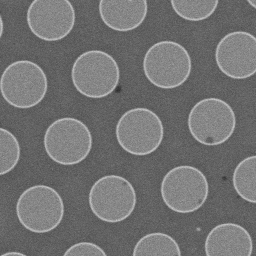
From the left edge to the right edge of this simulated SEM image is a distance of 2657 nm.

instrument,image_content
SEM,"an array of small figures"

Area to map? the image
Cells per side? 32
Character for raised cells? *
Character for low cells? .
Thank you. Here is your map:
....*****....*****....*****....*
....*****....*****....*****.....
...******....*****......*.......
....*****.....***...............
.....***....................****
....................**.....*****
...........**.....*****....*****
..........****....******...*****
.****....******...******....****
******...******...*****......**.
******...******....****.........
******....****..................
.****.....................*.....
........................*****...
...............*****....*****...
.......***.....*****....*****...
*.....*****....*****....*****...
**....*****....*****.....***....
**....*****....****.............
**....*****.....................
**......*.....................**
*....................****....***
............****....******...***
....**......*****...******...***
...****....******...******....**
..******...******....****.......
..******....****......**........
..******.....**.................
...****....................***..
..................***.....*****.
..........**.....*****....*****.
........*****....*****....*****.